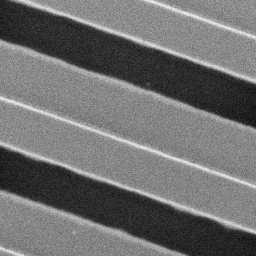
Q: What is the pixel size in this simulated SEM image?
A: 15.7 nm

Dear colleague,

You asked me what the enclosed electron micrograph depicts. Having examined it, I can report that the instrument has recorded lines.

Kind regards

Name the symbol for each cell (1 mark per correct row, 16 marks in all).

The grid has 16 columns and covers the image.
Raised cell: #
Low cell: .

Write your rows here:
...#############
......##########
........########
###........#####
#####.........##
########........
###########.....
##############..
################
.###############
....############
.......#########
#.........######
####.........###
#######.........
##########......